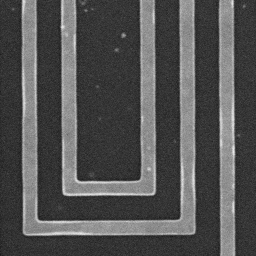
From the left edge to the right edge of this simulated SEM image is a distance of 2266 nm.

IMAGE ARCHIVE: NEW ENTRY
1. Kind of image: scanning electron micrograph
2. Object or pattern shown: groups of lines, slits or small figures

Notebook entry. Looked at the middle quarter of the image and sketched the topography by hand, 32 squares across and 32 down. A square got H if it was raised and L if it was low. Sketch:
HHHLLLLLLLLLLLLLLLLHHHLLLLLLLHHH
HHHLLLLLLLLLLLLLLLLHHHLLLLLLLHHH
HHHLLLLLLLLLLLLLLLLHHHHLLLLLLHHH
HHHLLLLLLLLLLLLLLLLHHHHLLLLLLHHH
HHHLLLLLLLLLLLLLLLLHHHHLLLLLLHHH
HHHLLLLLLLLLLLLLLLLHHHHLLLLLLHHH
HHHLLLLLLLLLLLLLLLLHHHHLLLLLLHHH
HHHLLLLLLLLLLLLLLLLHHHHLLLLLLHHH
HHHLLLLLLLLLLLLLLLLHHHHLLLLLLHHH
HHHLLLLLLLLLLLLLLLLHHHHLLLLLLHHH
HHHLLLLLLLLLLLLLLLLHHHHLLLLLLHHH
HHHLLLLLLLLLLLLLLLLHHHHLLLLLLHHH
HHHLLLLLLLLLLLLLLLLHHHHLLLLLLHHH
HHHLLLLLLLLLLLLLLLLHHHHLLLLLLHHH
HHHLLLLLLLLLLLLLLLLHHHHLLLLLLHHH
HHHLLLLLLLLLLLLLLLLHHHHLLLLLLHHH
HHHLLLLLLLLLLLLLLLLHHHHLLLLLLHHH
HHHLLLLLLLLLLLLLLLLHHHHLLLLLLHHH
HHHLLLLLLLLLLLLLLLLHHHHLLLLLLHHH
HHHLLLLLLLLLLLLLLLLHHHHLLLLLLHHH
HHHLLLLLLLLLLLLLLLLHHHHLLLLLLHHH
HHHLLLLLLLLLLLLLLLLHHHHLLLLLLHHH
HHHLLLLLLLLLLLLLLLLHHHHLLLLLLHHH
HHHLLLLLLLLLLLLLLLLHHHHLLLLLLHHH
HHHLLLLLLLLLLLLLLLLHHHHLLLLLLHHH
HHHLLLLLLLLLLLLLLLLHHHHLLLLLLHHH
HHHLLLLLLLLLLLLLLLLHHHHLLLLLLHHH
HHHLLLLLLLLLLLLLLLLHHHHLLLLLLLHH
HHHLLLLLLLLLLLLLLLLHHHHLLLLLLLHH
HHHHLLHHLLLHHHHHHHHHHHHLLLLLLLHH
HHHHHHHHHHHHHHHHHHHHHHHLLLLLLLHH
HHHHHHHHHHHHHHHHHHHHHHHLLLLLLHHH